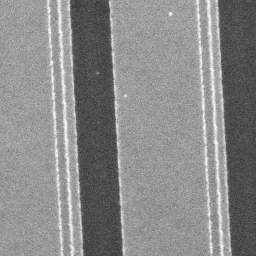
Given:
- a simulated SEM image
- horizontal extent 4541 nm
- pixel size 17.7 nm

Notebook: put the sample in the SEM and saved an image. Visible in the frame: lines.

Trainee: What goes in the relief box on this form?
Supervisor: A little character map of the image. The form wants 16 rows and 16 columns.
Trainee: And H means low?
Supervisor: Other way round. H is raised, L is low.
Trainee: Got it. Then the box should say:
HHHHLLLHHHHHHHLL
HHHHLLLHHHHHHHLL
HHHHLLLHHHHHHHLL
HHHHLLLHHHHHHHLL
HHHHHLLHHHHHHHLL
HHHHHLLHHHHHHHLL
HHHHHLLHHHHHHHLL
HHHHHLLHHHHHHHLL
HHHHHLLHHHHHHHLL
HHHHHLLHHHHHHHLL
HHHHHLLHHHHHHHLL
HHHHHLLHHHHHHHLL
HHHHHLLLHHHHHHLL
HHHHHLLLHHHHHHLL
HHHHHLLLHHHHHHLL
HHHHHLLLHHHHHHLL